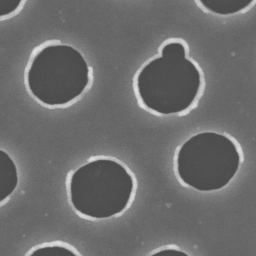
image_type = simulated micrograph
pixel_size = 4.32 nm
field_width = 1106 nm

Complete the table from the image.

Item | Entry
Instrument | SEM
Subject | holes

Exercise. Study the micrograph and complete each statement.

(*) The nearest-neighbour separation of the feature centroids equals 0.431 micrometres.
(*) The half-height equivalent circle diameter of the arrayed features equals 258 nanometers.